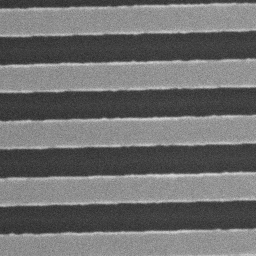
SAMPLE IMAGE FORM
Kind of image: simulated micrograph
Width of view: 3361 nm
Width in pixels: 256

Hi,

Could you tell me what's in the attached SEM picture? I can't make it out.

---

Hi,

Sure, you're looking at lines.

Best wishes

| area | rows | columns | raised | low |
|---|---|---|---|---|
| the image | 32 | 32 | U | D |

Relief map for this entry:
DDDDDDDDDDDDDDDDDDDDDDDDDDDDDUUD
UUUUUUUUUUUUUUUUUUUUUUUUUUUUUUUU
UUUUUUUUUUUUUUUUUUUUUUUUUUUUUUUU
UUUUUUUUUUUUUUUUUUUUUUUUUUUUUUUU
UUUUDDDDDDDDDDDDDDDDDDDDDDDDDDDD
DDDDDDDDDDDDDDDDDDDDDDDDDDDDDDDD
DDDDDDDDDDDDDDDDDDDDDDDDDDDDDDDD
DDDDDDDDDDDDDDDDDDDDDDDDDDDDDDDU
UUUUUUUUUUUUUUUUUUUUUUUUUUUUUUUU
UUUUUUUUUUUUUUUUUUUUUUUUUUUUUUUU
UUUUUUUUUUUUUUUUUUUUUUUUUUUUUUUU
UUUUUDDDDDDDDDDDDDDDDDDDDDDDDDDD
DDDDDDDDDDDDDDDDDDDDDDDDDDDDDDDD
DDDDDDDDDDDDDDDDDDDDDDDDDDDDDDDD
DDDDDDDDDDDDDDDDDDDDDDDDDDDDDDDD
UUUUUUUUUUUUUUUUUUUUUUUUUUUUUUUU
UUUUUUUUUUUUUUUUUUUUUUUUUUUUUUUU
UUUUUUUUUUUUUUUUUUUUUUUUUUUUUUUU
UUUUUUDDDDDDDDDDDDDDDDDDDDDDDDDD
DDDDDDDDDDDDDDDDDDDDDDDDDDDDDDDD
DDDDDDDDDDDDDDDDDDDDDDDDDDDDDDDD
DDDDDDDDDDDDDDDDDDDDDDDDDDDDDDDD
UUUUUUUUUUUUUUUUUUUUUUUUUUUUUUUU
UUUUUUUUUUUUUUUUUUUUUUUUUUUUUUUU
UUUUUUUUUUUUUUUUUUUUUUUUUUUUUUUU
UUUUUUUUUUUDDDDDDDDDDDDDDDDDDDDD
DDDDDDDDDDDDDDDDDDDDDDDDDDDDDDDD
DDDDDDDDDDDDDDDDDDDDDDDDDDDDDDDD
DDDDDDDDDDDDDDDDDDDDDDDDDDDDDDDD
UUUUUUUUUUUUUUUUUUUUUUUUUUUUUUUU
UUUUUUUUUUUUUUUUUUUUUUUUUUUUUUUU
UUUUUUUUUUUUUUUUUUUUUUUUUUUUUUUU